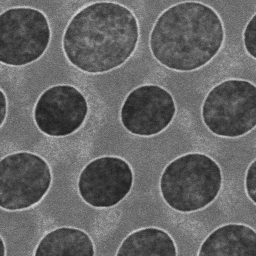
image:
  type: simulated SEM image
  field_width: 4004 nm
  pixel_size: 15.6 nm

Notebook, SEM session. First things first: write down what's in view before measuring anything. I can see holes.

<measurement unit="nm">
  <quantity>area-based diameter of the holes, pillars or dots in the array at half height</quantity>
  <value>872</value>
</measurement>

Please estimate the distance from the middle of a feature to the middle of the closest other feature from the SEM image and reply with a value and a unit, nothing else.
1.31 µm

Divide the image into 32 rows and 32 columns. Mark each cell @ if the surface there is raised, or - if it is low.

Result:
@@@@@@@@@@@@---@@@@@@@---@@@@@@@
@----@@@@@------@@@@@------@@@@@
------@@@--------@@@-------@@@@-
------@@---------@@---------@@@-
------@@---------@@---------@@--
------@@---------@@---------@@@-
-----@@@---------@@--------@@@@-
----@@@@@-------@@@@------@@@@@@
@@@@@@@@@@----@@@@@@@----@@@@@@@
@@@@@@@@@@@@@@@@@@@@@@@@@@@@@@@@
@@@@@@@@@@@@@@@@@@@@@@@@@@@----@
@@@@@@----@@@@@@-----@@@@@------
-@@@@------@@@@@------@@@@------
-@@@-------@@@@-------@@@-------
-@@@-------@@@@-------@@@-------
@@@@@-----@@@@@------@@@@@------
@@@@@----@@@@@@@----@@@@@@@----@
@@@@@@@@@@@@@@@@@@@@@@@@@@@@@@@@
@@@@@@@@@@@@@@@@@@@@@@@@@@@@@@@@
@----@@@@@@@@@@@@@@@@@@---@@@@@@
------@@@@@-----@@@@@------@@@@-
------@@@@------@@@@--------@@@-
------@@@@-------@@@--------@@@-
------@@@@------@@@@--------@@@-
-----@@@@@------@@@@-------@@@@-
----@@@@@@@---@@@@@@@-----@@@@@@
@@@@@@@@@@@@@@@@@@@@@@@@@@@@@@@@
@@@@@@@@@@@@@@@@@@@@@@@@@@@@@@@@
@@@@@@@@-@@@@@@@@@@@@@@@@@@----@
@@@@@@-----@@@@@-----@@@@@------
@@@@@------@@@@-------@@@-------
-@@@@-------@@@-------@@@-------